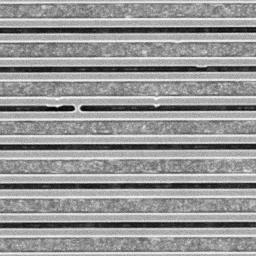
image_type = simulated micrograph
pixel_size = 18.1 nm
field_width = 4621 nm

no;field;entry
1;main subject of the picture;parallel lines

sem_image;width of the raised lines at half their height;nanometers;160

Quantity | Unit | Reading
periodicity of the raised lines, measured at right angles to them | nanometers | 344